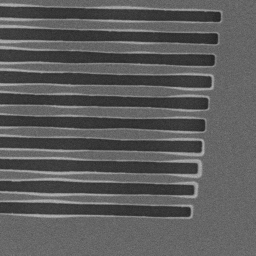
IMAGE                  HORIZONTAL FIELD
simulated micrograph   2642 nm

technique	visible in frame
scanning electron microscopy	groups of lines, slits or small figures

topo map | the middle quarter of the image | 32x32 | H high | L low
HHHHHHHHHHHHHHHHHHHHHHHHHHHLLLLL
HHHHHHHHHHHHHHHHHHHHHHHHHHHHHHHH
LLLLLLLLLLHHHHHHHHHHHHHHHHHHHHHH
LLLLLLLLLLLLLLLLLLLLLLLLLLLLLLLL
LLLLLLLLLLLLLLLLLLLLLLLLLLLLLLLL
HHLHHHHHHHLLLLLLLLLLLLLLLLLLLLLL
HHHHHHHHHHHHHHHHHHHHHHHHHHHHHHHH
HHHHHHHHHHHHHHHHHHHHHHHHHHHHHHHH
LLLLLLLLLLLLLLLLLLLLLLLLLLLLLLLL
LLLLLLLLLLLLLLLLLLLLLLLLLLLLLLLL
LLLLLLLLLLLLLLLLLLLLLLLLLLLLLLLL
HHHHHHHHHHHHHHHHHHHHHHHHHHHHHHLL
HHHHHHHHHHHHHHHHHHHHHHHHHHHHHHHH
LLLLLLLLLLLLLLLLLLLLLLLLLLLLLLLL
LLLLLLLLLLLLLLLLLLLLLLLLLLLLLLLL
LLLLLLLLLLLLLLLLLLLLLLLLLLLLLLLL
HHHHHHHHHHHHHHHHHHHHHHLLLLLLLLLL
HHHHHHHHHHHHHHHHHHHHHHHHHHHHHHHH
LLLLLLLLLHHHHHHHHHHHHHHHHHHHHHHH
LLLLLLLLLLLLLLLLLLLLLLLLLLLLLLLL
LLLLLLLLLLLLLLLLLLLLLLLLLLLLLLLL
LLLLLLLLLLLLLLLLLLLLLLLLLLLLLLLL
HHHHHHHHHHHHHHHHHHHHHHHHHHHHHHLL
HHHHHHHHHHHHHHHHHHHHHHHHHHHHHHHH
LLLLLLLLLLLLLLLLLLLLLLLLLLLLLLLL
LLLLLLLLLLLLLLLLLLLLLLLLLLLLLLLL
LLLLLLLLLLLLLLLLLLLLLLLLLLLLLLLL
HHHHHHHHHHHHHHHHHHLLLLLLLLLLLLLL
HHHHHHHHHHHHHHHHHHHHHHHHHHHHHHHH
LLLLLLLLLLLLHHHHHHHHHHHHHHHHHHHH
LLLLLLLLLLLLLLLLLLLLLLLLLLLLLLLL
LLLLLLLLLLLLLLLLLLLLLLLLLLLLLLLL